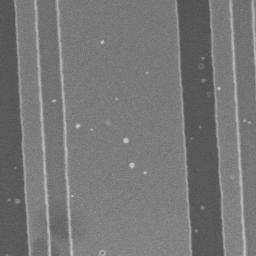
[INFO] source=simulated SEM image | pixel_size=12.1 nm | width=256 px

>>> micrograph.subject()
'lines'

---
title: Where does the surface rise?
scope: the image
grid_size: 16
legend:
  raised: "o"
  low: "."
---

.oooooooooo..ooo
.oooooooooo..ooo
.oooooooooo..ooo
.oooooooooo..ooo
.oooooooooo..ooo
.oooooooooo..ooo
.oooooooooo..ooo
.oooooooooo...oo
.ooooooooooo..oo
.ooooooooooo..oo
.ooooooooooo..oo
..oooooooooo..oo
..oooooooooo..oo
..oooooooooo..oo
..oooooooooo..oo
..oooooooooo..oo